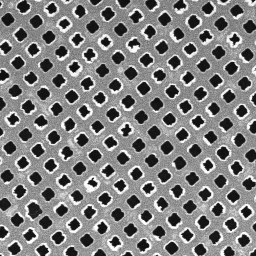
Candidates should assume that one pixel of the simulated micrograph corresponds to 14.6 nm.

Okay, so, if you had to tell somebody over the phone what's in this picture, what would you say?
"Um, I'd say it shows a regular array of holes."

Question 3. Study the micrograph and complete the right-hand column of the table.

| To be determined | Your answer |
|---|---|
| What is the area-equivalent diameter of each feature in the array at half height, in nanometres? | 174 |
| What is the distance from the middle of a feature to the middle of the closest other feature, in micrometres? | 0.287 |